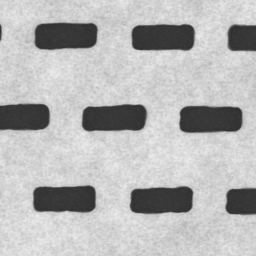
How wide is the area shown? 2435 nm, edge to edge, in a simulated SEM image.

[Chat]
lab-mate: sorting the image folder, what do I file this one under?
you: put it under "holes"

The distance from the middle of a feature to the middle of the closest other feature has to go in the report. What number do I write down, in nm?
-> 898